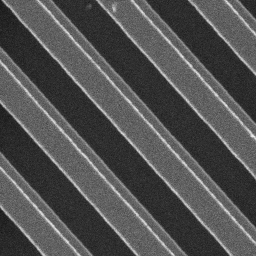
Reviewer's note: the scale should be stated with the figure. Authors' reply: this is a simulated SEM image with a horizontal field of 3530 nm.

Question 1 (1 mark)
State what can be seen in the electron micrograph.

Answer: lines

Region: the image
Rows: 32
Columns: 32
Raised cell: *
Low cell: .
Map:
.******.....*******.....******..
..******.....******......******.
..*******.....******......******
...*******.....******......*****
....******......******......****
.....******......******.....****
*.....******......******.....***
*......******......******.....**
**......******......******.....*
***......******.....*******.....
****......******.....******.....
*****......******.....******....
******.....*******.....******...
.******.....******......******..
..******.....******......******.
..*******.....******......******
...*******.....******......*****
....******......******......****
.....******......******......***
......******......******.....***
*......******......******.....**
**......******.....*******.....*
***......******.....*******.....
****......******.....******.....
*****.....*******.....******....
******.....*******.....******...
.******.....******......******..
.*******.....******......******.
..******......******......******
...******......******......*****
....******......******......****
.....******......******.....****